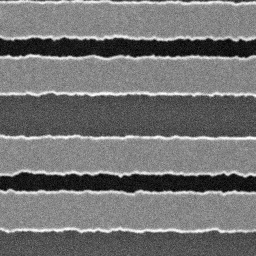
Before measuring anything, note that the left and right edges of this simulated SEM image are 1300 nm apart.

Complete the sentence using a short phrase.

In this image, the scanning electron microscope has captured lines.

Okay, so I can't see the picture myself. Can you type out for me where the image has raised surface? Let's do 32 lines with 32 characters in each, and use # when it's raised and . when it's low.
################################
################################
################################
################################
################################
................................
................................
################################
################################
################################
################################
################################
................................
................................
................................
................................
................................
################################
################################
################################
################################
################################
................................
................................
################################
################################
################################
################################
################################
................................
................................
................................